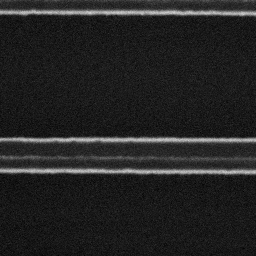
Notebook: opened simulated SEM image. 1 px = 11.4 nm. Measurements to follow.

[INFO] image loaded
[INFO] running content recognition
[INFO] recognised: lines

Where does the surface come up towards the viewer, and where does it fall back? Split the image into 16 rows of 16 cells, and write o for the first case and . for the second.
oooooooooooooooo
................
................
................
................
................
................
................
................
oooooooooooooooo
oooooooooooooooo
................
................
................
................
................